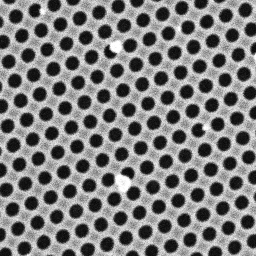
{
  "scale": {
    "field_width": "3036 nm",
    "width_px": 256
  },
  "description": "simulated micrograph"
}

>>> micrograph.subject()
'a regular array of holes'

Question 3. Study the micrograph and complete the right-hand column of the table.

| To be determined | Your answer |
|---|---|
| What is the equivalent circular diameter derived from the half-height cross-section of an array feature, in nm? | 175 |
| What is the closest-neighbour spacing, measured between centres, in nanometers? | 236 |